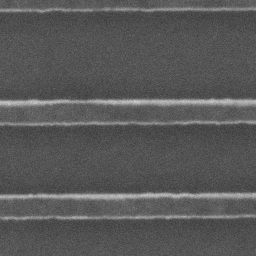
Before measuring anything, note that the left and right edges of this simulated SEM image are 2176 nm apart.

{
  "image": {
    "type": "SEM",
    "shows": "lines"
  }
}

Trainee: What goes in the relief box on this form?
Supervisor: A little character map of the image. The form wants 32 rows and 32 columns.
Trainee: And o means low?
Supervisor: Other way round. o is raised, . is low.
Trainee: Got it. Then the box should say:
oooooooooooooooooooooooooooooooo
................................
................................
................................
................................
................................
................................
................................
................................
................................
................................
................................
................................
oooooooooooooooooooooooooooooooo
oooooooooooooooooooooooooooooooo
ooooooooo.......................
................................
................................
................................
................................
................................
................................
................................
................................
oooooooooooooooooooooooooooooooo
oooooooooooooooooooooooooooooooo
oooooooooooooooooooooooooooooooo
................................
................................
................................
................................
................................